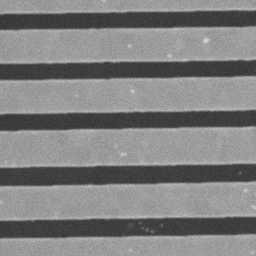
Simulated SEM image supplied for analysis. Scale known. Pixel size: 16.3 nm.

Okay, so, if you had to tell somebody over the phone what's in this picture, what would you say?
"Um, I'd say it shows lines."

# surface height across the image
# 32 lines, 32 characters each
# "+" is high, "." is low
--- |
++++++++++++++++++++++++++++++++
++++++++++++++..................
................................
.........................+++++++
++++++++++++++++++++++++++++++++
++++++++++++++++++++++++++++++++
++++++++++++++++++++++++++++++++
+++++++++++++++++++++++++++++++.
................................
................................
++++++++++++++++++++++++++++++++
++++++++++++++++++++++++++++++++
++++++++++++++++++++++++++++++++
++++++++++++++++++++++++++++++++
................................
................................
++++++++++++++++++++++++++++++++
++++++++++++++++++++++++++++++++
++++++++++++++++++++++++++++++++
++++++++++++++++++++++++++++++++
++++++++++++++++++++++++++++....
................................
................................
++++++++++++++++++++++++++++++++
++++++++++++++++++++++++++++++++
++++++++++++++++++++++++++++++++
++++++++++++++++++++++++++++++++
++++............................
................................
.........................+++++++
++++++++++++++++++++++++++++++++
++++++++++++++++++++++++++++++++